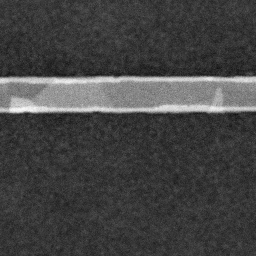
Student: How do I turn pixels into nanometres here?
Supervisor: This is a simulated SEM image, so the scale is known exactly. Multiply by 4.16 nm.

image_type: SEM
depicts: one or a few lines or trenches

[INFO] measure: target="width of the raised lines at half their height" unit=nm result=128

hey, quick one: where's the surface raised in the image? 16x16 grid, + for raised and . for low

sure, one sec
................
................
................
................
................
++++++++++++++++
++++++++++++++++
................
................
................
................
................
................
................
................
................